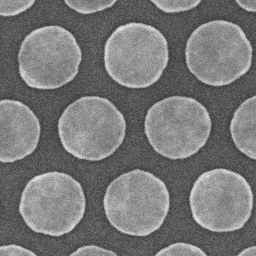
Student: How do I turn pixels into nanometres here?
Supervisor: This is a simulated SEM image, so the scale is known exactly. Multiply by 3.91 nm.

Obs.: a regular array of raised bodies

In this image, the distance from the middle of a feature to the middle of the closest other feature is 0.322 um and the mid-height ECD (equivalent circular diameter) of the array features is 246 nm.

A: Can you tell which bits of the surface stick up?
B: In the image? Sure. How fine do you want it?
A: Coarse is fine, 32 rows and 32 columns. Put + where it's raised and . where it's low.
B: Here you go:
++++....++++++.....++++++.....++
++........++....................
................................
......+........++++......+++++..
....+++++.....++++++....++++++..
...+++++++...++++++++..++++++++.
..++++++++...++++++++..++++++++.
..++++++++...++++++++..++++++++.
...+++++++...+++++++....+++++++.
...++++++.....++++++.....+++++..
....++++.......++++.......++....
................................
..........+++........+++.......+
++++.....+++++.....++++++.....++
++++....+++++++...++++++++...+++
+++++..+++++++++..++++++++...+++
+++++..++++++++...++++++++...+++
+++++...+++++++....+++++++...+++
++++....+++++++....++++++.....++
+++.......+++........+++.......+
................................
................++........+++...
....+++++.....++++++.....+++++..
...+++++++....+++++++...+++++++.
...+++++++...++++++++...+++++++.
...+++++++...++++++++...+++++++.
...+++++++...++++++++...+++++++.
...+++++++....++++++.....++++++.
....+++++......+++++......++++..
................................
......................+.........
++++.....+++++......+++++.....++